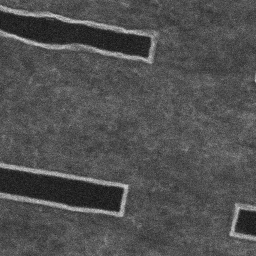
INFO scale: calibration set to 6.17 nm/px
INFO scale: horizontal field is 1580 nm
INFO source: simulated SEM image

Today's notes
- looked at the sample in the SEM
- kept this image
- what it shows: one or a few lines or trenches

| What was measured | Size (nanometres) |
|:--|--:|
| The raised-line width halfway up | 183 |